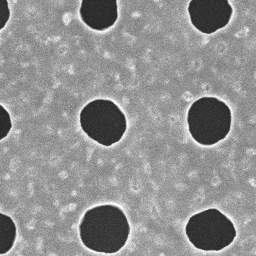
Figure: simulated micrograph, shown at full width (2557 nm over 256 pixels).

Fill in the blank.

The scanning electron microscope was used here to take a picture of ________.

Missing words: holes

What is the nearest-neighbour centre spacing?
1060 nm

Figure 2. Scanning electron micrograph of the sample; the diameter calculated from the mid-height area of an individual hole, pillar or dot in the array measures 460 nm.